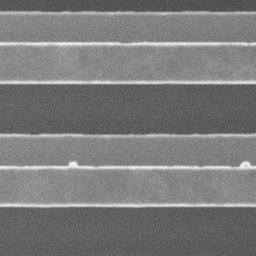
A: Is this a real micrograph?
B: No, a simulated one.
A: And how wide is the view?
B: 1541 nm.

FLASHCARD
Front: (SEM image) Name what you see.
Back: lines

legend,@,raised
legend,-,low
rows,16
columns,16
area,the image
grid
----------------
@@@@@@@@@@@@@@@@
@@@@@@@@@@@@@@@@
@@@@@@@@@@@@@@@@
@@@@@@@@@@@@@@@@
----------------
----------------
----------------
@@@@@@@@@@@@@@@@
@@@@@@@@@@@@@@@@
@@@@@@@@@@@@@@@@
@@@@@@@@@@@@@@@@
@@@@@@@@@@@@@@@@
----------------
----------------
----------------